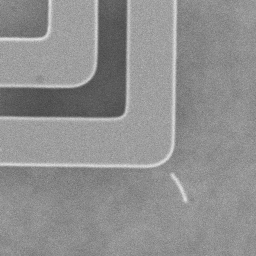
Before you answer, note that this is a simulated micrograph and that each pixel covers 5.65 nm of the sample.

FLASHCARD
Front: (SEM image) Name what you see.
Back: groups of lines, slits or small figures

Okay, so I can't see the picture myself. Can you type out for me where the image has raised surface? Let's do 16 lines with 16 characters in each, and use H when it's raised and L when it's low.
LLLHHHLLHHHLLLLL
LLLHHHLLHHHLLLLL
HHHHHHLLHHHLLLLL
HHHHHHLLHHHLLLLL
HHHHHHLLHHHLLLLL
LLLLLLLLHHHLLLLL
LLLLLLLLHHHLLLLL
HHHHHHHHHHHLLLLL
HHHHHHHHHHHLLLLL
HHHHHHHHHHHLLLLL
LLLLLLLLLLLLLLLL
LLLLLLLLLLLLLLLL
LLLLLLLLLLLLLLLL
LLLLLLLLLLLLLLLL
LLLLLLLLLLLLLLLL
LLLLLLLLLLLLLLLL